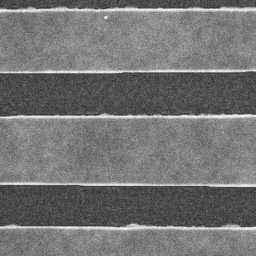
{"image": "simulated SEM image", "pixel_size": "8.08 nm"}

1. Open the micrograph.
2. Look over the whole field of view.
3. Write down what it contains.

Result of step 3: lines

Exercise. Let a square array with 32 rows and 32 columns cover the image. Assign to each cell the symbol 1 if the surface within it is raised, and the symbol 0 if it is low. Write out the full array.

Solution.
00000000000000000000000000000000
11111111111111111111111111111111
11111111111111111111111111111111
11111111111111111111111111111111
11111111111111111111111111111111
11111111111111111111111111111111
11111111111111111111111111111111
11111111111111111111111111111111
11111111111111111111111111111111
00000000000000000000000000000000
00000000000000000000000000000000
00000000000000000000000000000000
00000000000000000000000000000000
00000000000000000000000000000000
00000000000000000000000000011111
11111111111111111111111111111111
11111111111111111111111111111111
11111111111111111111111111111111
11111111111111111111111111111111
11111111111111111111111111111111
11111111111111111111111111111111
11111111111111111111111111111111
11111111111111111111111111111111
00000000000000000000000000000000
00000000000000000000000000000000
00000000000000000000000000000000
00000000000000000000000000000000
00000000000000000000000000000000
11111111111111001111111100000000
11111111111111111111111111111111
11111111111111111111111111111111
11111111111111111111111111111111